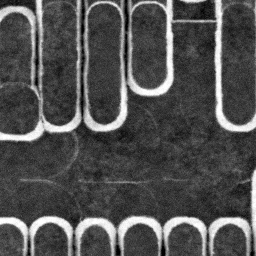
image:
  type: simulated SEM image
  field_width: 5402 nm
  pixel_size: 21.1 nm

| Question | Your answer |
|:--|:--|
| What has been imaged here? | wiring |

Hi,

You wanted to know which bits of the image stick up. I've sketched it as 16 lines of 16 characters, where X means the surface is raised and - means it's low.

--XXXXXXXX----XX
XXXXXXXXXXX---XX
XXXXXXXXXXX---XX
XXXXXXXXXXX---XX
XXXXXXXXXXX---XX
XXXXXXXX-X----XX
XXXXXXXX------XX
XXXXX-X-------XX
XX--------------
----------------
----------------
----------------
----------------
----------------
XXXX-XX-XXXXXXXX
XXXXXXXXXXXXXXXX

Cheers